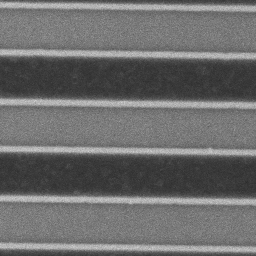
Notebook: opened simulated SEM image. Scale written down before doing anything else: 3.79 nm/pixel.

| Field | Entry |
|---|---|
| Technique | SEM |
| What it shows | one or a few lines or trenches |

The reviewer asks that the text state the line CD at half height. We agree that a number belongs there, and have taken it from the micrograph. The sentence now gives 50.4 pixels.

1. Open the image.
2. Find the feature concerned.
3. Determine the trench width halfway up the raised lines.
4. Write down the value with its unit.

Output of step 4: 177 nm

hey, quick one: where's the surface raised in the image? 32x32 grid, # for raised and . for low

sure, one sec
################################
................................
................................
................................
................................
................................
................................
################################
################################
################################
################################
################################
################################
................................
................................
................................
................................
................................
................................
################################
################################
################################
################################
################################
################################
................................
................................
................................
................................
................................
................................
################################